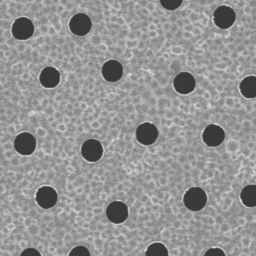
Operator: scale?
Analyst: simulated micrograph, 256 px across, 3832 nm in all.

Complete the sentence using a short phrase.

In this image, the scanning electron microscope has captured a regular array of holes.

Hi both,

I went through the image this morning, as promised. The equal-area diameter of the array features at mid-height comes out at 22.9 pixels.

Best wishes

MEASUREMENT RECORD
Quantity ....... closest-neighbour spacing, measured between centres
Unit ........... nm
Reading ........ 865